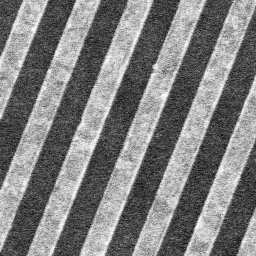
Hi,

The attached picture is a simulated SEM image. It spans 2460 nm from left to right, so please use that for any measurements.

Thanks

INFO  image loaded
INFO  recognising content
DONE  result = parallel lines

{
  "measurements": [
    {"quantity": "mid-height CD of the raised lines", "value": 199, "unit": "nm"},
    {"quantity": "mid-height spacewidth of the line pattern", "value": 265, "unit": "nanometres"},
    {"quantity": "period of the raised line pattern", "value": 469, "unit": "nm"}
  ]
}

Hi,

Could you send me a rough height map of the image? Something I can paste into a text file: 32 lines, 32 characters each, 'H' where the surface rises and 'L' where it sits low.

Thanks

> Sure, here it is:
LLLHHHLLLHHHLLLLHHHLLLLHHLLLLHHH
LLHHHLLLLHHHLLLLHHLLLLHHHLLLLHHL
LLHHHLLLLHHLLLLHHHLLLLHHHLLLHHHL
LLHHLLLLHHHLLLLHHHLLLHHHLLLLHHHL
LHHHLLLLHHHLLLHHHLLLLHHHLLLLHHLL
LHHHLLLHHHLLLLHHHLLLLHHLLLLHHHLL
HHHLLLLHHHLLLLHHLLLLHHHLLLLHHLLL
HHHLLLLHHLLLLHHHLLLLHHHLLLHHHLLL
HHLLLLHHHLLLLHHHLLLHHHLLLLHHHLLL
HHLLLLHHHLLLHHHLLLLHHHLLLLHHLLLL
HHLLLHHHLLLLHHHLLLLHHLLLLHHHLLLL
HLLLLHHHLLLLHHLLLLHHHLLLLHHHLLLH
HLLLLHHLLLLHHHLLLLHHHLLLHHHLLLLH
LLLLHHHLLLLHHHLLLHHHLLLLHHHLLLHH
LLLLHHHLLLHHHLLLLHHHLLLLHHLLLLHH
LLLLHHLLLLHHHLLLLHHLLLLHHHLLLLHH
LLLHHHLLLLHHLLLLHHHLLLLHHHLLLHHH
LLLHHLLLLHHHLLLLHHHLLLHHHLLLLHHH
LLHHHLLLLHHHLLLHHHLLLLHHHLLLLHHL
LLHHHLLLHHHLLLLHHHLLLLHHLLLLHHHL
LLHHLLLLHHHLLLLHHLLLLHHHLLLLHHHL
LHHHLLLLHHLLLLHHHLLLLHHHLLLHHHLL
LHHLLLLHHHLLLLHHHLLLHHHLLLLHHHLL
HHHLLLLHHHLLLHHHLLLLHHHLLLLHHLLL
HHHLLLHHHLLLLHHHLLLLHHLLLLHHHLLL
HHLLLLHHHLLLLHHLLLLHHHLLLLHHHLLL
HHLLLLHHLLLLHHHLLLLHHHLLLHHHLLLL
HLLLLHHHLLLLHHHLLLHHHLLLLHHHLLLH
HLLLLHHHLLLHHHLLLLHHHLLLLHHLLLLH
HLLLHHHLLLLHHHLLLLHHLLLLHHHLLLLH
LLLLHHHLLLLHHLLLLHHHLLLLHHHLLLHH
LLLLHHLLLLHHHLLLLHHHLLLHHHLLLLHH